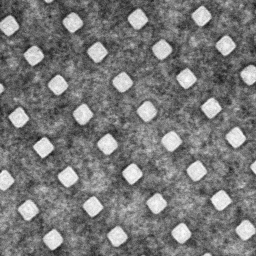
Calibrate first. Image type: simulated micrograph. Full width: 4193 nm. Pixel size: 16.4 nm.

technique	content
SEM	a regular array of raised bodies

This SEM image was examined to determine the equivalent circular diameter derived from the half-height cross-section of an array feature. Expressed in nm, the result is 284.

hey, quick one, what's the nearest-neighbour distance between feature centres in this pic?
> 38.2 px